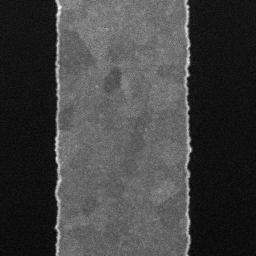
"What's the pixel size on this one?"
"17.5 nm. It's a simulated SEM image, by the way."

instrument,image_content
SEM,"one or a few lines or trenches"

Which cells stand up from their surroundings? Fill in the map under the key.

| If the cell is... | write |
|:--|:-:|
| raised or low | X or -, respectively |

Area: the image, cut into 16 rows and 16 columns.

----XXXXXXXX----
----XXXXXXXX----
----XXXXXXXX----
----XXXXXXXX----
----XXXXXXXX----
----XXXXXXXX----
----XXXXXXXX----
----XXXXXXXX----
----XXXXXXXX----
----XXXXXXXX----
----XXXXXXXX----
----XXXXXXXX----
----XXXXXXXX----
----XXXXXXXX----
----XXXXXXXX----
----XXXXXXXX----